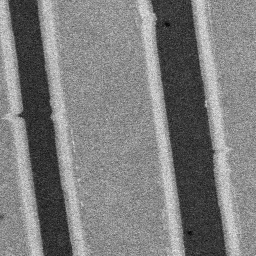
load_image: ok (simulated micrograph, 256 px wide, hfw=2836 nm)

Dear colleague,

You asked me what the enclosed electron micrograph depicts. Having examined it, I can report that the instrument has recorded one or a few lines or trenches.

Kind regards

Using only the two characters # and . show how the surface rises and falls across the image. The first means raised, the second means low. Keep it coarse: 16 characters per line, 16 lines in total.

...######....###
...######....###
...######....###
#..######....###
#..#######...###
#...######...###
#...######...###
#...######....##
#...######....##
#...######....##
#...######....##
##..#######...##
##...######...##
##...######...##
##...######....#
##...######....#